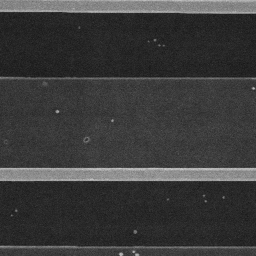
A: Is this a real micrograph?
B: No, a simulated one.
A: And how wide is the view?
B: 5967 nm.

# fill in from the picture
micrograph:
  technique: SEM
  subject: lines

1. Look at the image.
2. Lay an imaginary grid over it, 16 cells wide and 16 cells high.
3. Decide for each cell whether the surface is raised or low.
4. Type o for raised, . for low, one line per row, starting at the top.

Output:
oooooooooooooooo
................
................
................
................
oooooooooooooooo
oooooooooooooooo
oooooooooooooooo
oooooooooooooooo
oooooooooooooooo
oooooooooooooooo
................
................
................
................
oooooooooooooooo